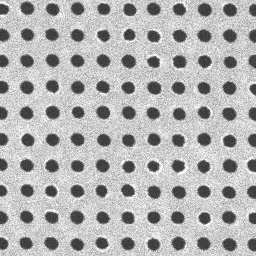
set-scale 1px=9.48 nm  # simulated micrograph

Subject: a regular array of holes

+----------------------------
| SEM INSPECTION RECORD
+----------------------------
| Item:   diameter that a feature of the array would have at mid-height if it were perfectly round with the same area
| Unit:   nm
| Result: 128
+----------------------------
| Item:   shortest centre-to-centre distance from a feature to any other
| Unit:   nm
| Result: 237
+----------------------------